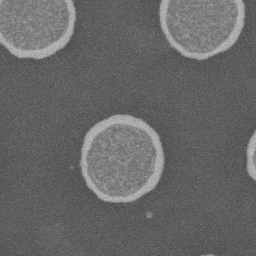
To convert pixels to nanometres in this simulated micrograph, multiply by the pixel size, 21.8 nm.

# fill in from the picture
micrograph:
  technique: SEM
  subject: raised bodies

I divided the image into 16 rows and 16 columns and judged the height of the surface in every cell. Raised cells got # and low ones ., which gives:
####......#####.
####......#####.
####.......###..
............#...
................
................
................
................
......####......
.....#####......
.....#####......
......###.......
................
................
................
................